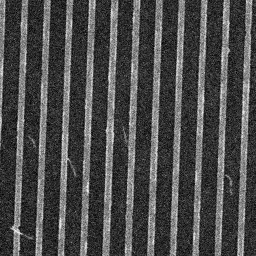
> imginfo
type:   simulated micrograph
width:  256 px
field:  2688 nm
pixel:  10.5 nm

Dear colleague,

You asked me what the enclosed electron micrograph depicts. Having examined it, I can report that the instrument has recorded parallel lines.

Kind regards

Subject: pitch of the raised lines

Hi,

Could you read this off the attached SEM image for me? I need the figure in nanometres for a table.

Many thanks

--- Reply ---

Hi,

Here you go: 235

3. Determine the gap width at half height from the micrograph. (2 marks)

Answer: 0.176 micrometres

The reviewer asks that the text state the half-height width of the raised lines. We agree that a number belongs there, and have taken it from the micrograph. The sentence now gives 60.3 nm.